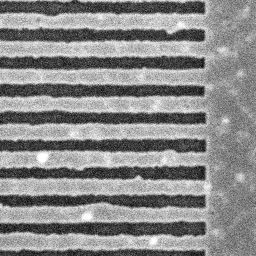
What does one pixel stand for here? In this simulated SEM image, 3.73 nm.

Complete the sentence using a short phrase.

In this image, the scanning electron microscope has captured parallel lines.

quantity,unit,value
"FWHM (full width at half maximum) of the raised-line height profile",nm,56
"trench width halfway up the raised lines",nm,45.7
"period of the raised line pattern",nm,103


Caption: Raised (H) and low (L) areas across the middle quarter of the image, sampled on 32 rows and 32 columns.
LLLLLLLLLLLLLLLLLLLLLLLLLLLLLLLL
LLLLLLHHHHHHHHHLHHHHHHHHLLLLLLHH
HHHHHHHHHHHHHHHHHHHHHHHHHHHHHHHH
HHHHHHHHHHHHHHHHHHHHHHHHHHHHHHHH
HHHHHHHHHHHHHHHHHHHHHHHHHHHHHHHH
LLLLLLLLLLLLLLLLLLLLLLLLLLLLLLLL
LLLLLLLLLLLLLLLLLLLLLLLLLLLLLLLL
LLLLLLLLLLLLLLLLLLLLLLLLLLLLLLLL
HHLLHHHHHHHHHHHHHHHHHHHHHHHHHHHH
HHHHHHHHHHHHHHHHHHHHHHHHHHHHHHHH
HHHHHHHHHHHHHHHHHHHHHHHHHHHHHHHH
HHHHHHHHHHHHHHHHHHHHHHHHHHHHHHHH
LLLLLLLLLLLLLLLLLLLLLLLLLLLLLLLL
LLLLLLLLLLLLLLLLLLLLLLLLLLLLLLLL
LLLLLLLLLLLLLLLLLLLLLLLLLLLLLLLL
HHHHHHHHHHHHHHHHHHHHHHHHHHHHHHHH
HHHHHHHHHHHHHHHHHHHHHHHHHHHHHHHH
HHHHHHHHHHHHHHHHHHHHHHHHHHHHHHHH
HHHHHHHHHHHHHHHHHHHHHHHHHHHHHHHH
LLLLLLLLLLLLLLLLLLLLLLLLLLLLLLLL
LLLLLLLLLLLLLLLLLLLLLLLLLLLLLLLL
LLLLLLLLLLLLLLLLLLLLLLLLLLLLLLLL
HHHHHHHHHHHHHHHHHHHHHHHHHHHHHHHH
HHHHHHHHHHHHHHHHHHHHHHHHHHHHHHHH
HHHHHHHHHHHHHHHHHHHHHHHHHHHHHHHH
HHHHHHHHHHHHHHHLHHHHHHHLHLLLLLLL
LLLHHLLLLLLLLLLLLLLLLLLLLLLLLLLL
LLLLLLLLLLLLLLLLLLLLLLLLLLLLLLLL
LLLLLLLLLLLLLLLLLLHLLLLLLLLLLLLL
HHHHHHHHHHHHHHHHHHHHHHHHHHHHHHHH
HHHHHHHHHHHHHHHHHHHHHHHHHHHHHHHH
HHHHHHHHHHHHHHHHHHHHHHHHHHHHHHHH